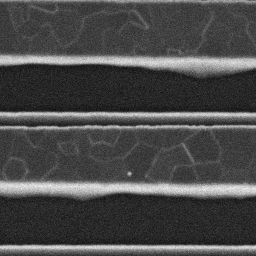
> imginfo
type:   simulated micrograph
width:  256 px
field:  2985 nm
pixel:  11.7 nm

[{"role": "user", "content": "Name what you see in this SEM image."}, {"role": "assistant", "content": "lines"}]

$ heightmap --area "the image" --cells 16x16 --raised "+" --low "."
++++++++++++++++
++++++++++++++++
++++++++++++++++
++++++++++++++++
................
................
................
++++++++++++++++
++++++++++++++++
++++++++++++++++
++++++++++++++++
++++++++++++++++
................
................
................
................